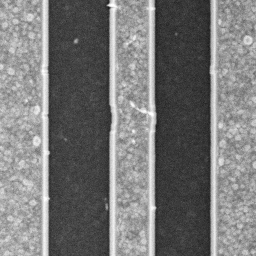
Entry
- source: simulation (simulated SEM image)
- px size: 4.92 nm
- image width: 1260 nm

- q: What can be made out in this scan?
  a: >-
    one or a few lines or trenches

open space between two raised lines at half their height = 308 nm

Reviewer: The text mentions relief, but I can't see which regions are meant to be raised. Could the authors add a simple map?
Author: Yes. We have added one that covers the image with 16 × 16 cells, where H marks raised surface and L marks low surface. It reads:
HHHLLLLHHHLLLHHH
HHHLLLLHHLLLLHHH
HHHLLLLHHHLLLHHH
HHHLLLLHHHLLLHHH
HHHLLLLHHHLLLHHH
HHHLLLLHHHLLLHHH
HHHLLLLHHHLLLHHH
HHHLLLLHHHLLLHHH
HHHLLLLHHHLLLHHH
HHHLLLLHHHLLLHHH
HHHLLLLHHHLLLHHH
HHHLLLLHHHLLLHHH
HHHLLLLHHHLLLHHH
HHHLLLLHHHLLLHHH
HHHLLLLHHHLLLHHH
HHHLLLLHHHLLLHHH